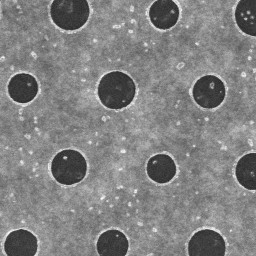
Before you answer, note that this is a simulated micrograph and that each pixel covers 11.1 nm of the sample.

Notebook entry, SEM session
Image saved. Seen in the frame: holes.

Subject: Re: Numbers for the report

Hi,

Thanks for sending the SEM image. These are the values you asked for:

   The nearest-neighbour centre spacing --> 1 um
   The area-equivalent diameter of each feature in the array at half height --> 372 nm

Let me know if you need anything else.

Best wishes